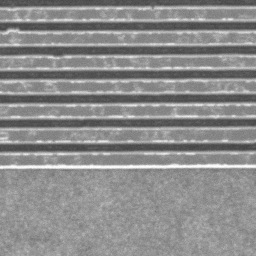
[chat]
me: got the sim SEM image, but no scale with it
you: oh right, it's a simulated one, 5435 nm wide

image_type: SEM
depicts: parallel lines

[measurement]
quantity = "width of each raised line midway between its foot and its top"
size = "292 nanometres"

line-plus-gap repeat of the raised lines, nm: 514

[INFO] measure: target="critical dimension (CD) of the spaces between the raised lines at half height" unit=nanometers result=231